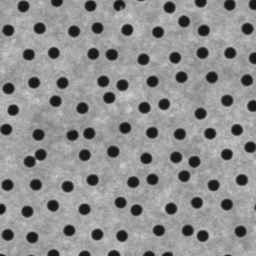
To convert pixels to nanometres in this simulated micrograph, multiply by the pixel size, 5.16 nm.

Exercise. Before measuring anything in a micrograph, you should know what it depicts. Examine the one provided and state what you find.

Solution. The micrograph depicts a regular array of holes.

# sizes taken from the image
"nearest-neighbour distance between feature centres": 121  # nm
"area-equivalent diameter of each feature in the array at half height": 61.3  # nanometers